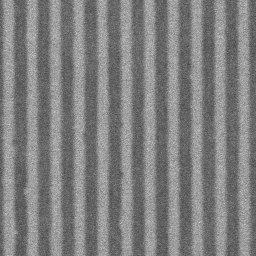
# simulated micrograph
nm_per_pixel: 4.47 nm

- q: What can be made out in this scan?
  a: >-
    parallel lines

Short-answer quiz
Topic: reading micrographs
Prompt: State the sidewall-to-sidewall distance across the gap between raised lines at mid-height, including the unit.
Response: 55.3 nm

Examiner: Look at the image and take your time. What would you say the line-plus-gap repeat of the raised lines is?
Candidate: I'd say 105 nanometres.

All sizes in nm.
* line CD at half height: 50.9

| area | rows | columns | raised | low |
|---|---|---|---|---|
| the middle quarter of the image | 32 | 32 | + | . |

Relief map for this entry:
..+++....++...+++...+++...+++...
...++....++...+++...+++...+++...
..+++....++...+++...+++...+++...
..+++....++...+++...+++...+++..+
..+++....++...+++...+++...+++...
..+++....++...+++...+++...+++...
..+++...+++...+++...+++...+++...
..+++...+++...+++...+++...+++...
..+++...+++...+++...+++...+++...
..+++...+++...+++...+++...+++...
..+++...+++...+++...+++...+++...
..+++...+++...+++...+++...+++...
..+++...+++...+++...+++...+++...
..+++...+++...+++...+++...+++...
..+++...+++...+++...+++...+++...
..+++...+++....++...+++...+++...
..+++...+++...+++...+++...+++...
..+++...+++...+++...+++...+++...
..+++...+++...+++...+++...+++...
..+++...+++...+++...+++...+++...
..+++...+++...+++...+++...+++...
..+++...+++...+++...+++...+++...
...++...+++...+++...+++...+++...
..+++...+++...+++...+++...+++...
..+++...+++...+++...+++...+++...
..+++...+++...+++...+++...+++...
..+++...+++...+++...+++...+++...
..+++...+++....++...+++...+++...
...++...+++...+++...+++...+++...
...++...+++...+++...+++...+++...
...++...+++...+++...+++...+++...
...++...+++...+++...+++...+++...